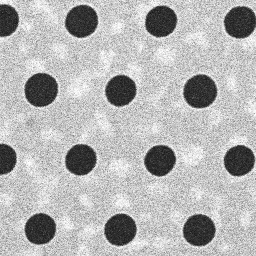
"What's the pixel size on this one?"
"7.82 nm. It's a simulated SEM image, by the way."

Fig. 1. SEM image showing a regular array of holes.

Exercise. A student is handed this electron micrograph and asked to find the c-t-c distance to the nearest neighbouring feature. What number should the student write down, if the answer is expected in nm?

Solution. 621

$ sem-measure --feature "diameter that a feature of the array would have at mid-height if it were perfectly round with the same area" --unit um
0.251